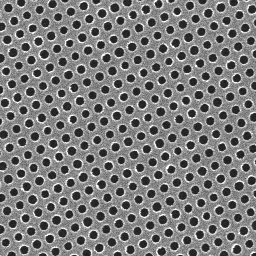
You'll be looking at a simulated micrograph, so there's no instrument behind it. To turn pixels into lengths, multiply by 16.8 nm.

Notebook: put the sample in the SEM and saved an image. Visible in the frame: a regular array of holes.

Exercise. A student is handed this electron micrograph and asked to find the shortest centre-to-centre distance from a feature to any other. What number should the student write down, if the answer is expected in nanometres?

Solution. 231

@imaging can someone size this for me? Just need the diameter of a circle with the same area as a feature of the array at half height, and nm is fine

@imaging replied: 140